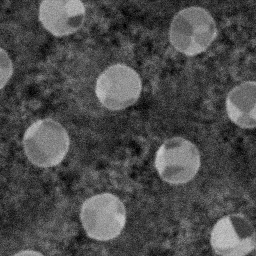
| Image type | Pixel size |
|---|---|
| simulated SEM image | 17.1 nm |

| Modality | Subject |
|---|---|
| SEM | raised bodies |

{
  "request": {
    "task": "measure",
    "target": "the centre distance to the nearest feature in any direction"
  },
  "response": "1.59 µm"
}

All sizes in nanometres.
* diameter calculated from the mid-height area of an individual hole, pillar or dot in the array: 768